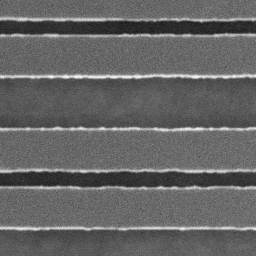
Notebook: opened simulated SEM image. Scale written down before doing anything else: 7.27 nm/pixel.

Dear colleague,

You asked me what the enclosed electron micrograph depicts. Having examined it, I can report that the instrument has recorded lines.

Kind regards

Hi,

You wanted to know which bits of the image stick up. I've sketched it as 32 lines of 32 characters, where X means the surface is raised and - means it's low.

XXXXXXXXXXXXXXXXXXXXXXXXXXXXXXXX
XXXXXXXXXXXXXXXXXXXXXXXXXXXXXXXX
------------------------XX-XX---
--------------------------------
XXXXXXXXXXXXXXXXXXXXXXXXXXXXXXXX
XXXXXXXXXXXXXXXXXXXXXXXXXXXXXXXX
XXXXXXXXXXXXXXXXXXXXXXXXXXXXXXXX
XXXXXXXXXXXXXXXXXXXXXXXXXXXXXXXX
XXXXXXXXXXXXXXXXXXXXXXXXXXXXXXXX
XXXXXXXXXXXXXXXXXX------XXXXXX--
--------------------------------
--------------------------------
--------------------------------
--------------------------------
--------------------------------
--------------------------------
XXXXXXXXXXXXXXXXXXXXXXXXXXXXXXXX
XXXXXXXXXXXXXXXXXXXXXXXXXXXXXXXX
XXXXXXXXXXXXXXXXXXXXXXXXXXXXXXXX
XXXXXXXXXXXXXXXXXXXXXXXXXXXXXXXX
XXXXXXXXXXXXXXXXXXXXXXXXXXXXXXXX
--------------------------------
--------------------------------
XXXXXXXXXX--XXXX-XXXXX-XX-XXXXXX
XXXXXXXXXXXXXXXXXXXXXXXXXXXXXXXX
XXXXXXXXXXXXXXXXXXXXXXXXXXXXXXXX
XXXXXXXXXXXXXXXXXXXXXXXXXXXXXXXX
XXXXXXXXXXXXXXXXXXXXXXXXXXXXXXXX
XXXXXXXXXXXXXXXXXXXXXXXXXXXXXXXX
--------------------------------
--------------------------------
--------------------------------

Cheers